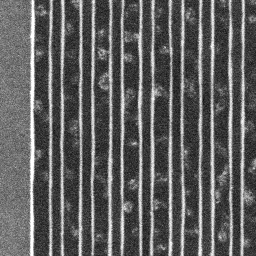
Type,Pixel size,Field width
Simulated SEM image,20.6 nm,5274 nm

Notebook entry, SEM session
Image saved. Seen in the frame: parallel lines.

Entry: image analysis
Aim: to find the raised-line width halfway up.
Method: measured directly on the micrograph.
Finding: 391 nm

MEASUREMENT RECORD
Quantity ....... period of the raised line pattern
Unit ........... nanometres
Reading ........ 618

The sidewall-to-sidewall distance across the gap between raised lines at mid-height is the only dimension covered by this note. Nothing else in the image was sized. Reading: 0.227 micrometres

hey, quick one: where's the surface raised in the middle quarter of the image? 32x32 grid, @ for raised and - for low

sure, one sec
@@@@---@@@@@---@@@@---@@@@@---@@
@@@@---@@@@@---@@@@---@@@@@---@@
@@@@---@@@@@---@@@@---@@@@@---@@
@@@@---@@@@@---@@@@---@@@@@---@@
@@@@---@@@@@---@@@@---@@@@@---@@
@@@@---@@@@@---@@@@----@@@@---@@
@@@@---@@@@@---@@@@---@@@@@---@@
@@@@---@@@@----@@@@---@@@@@--@@@
@@@@---@@@@@---@@@@---@@@@@--@@@
@@@@---@@@@@---@@@@---@@@@@--@@@
@@@@---@@@@@---@@@@---@@@@@--@@@
@@@@---@@@@@---@@@@---@@@@---@@@
@@@@---@@@@@---@@@@---@@@@@--@@@
@@@@---@@@@@---@@@@---@@@@---@@@
@@@@---@@@@@---@@@@---@@@@---@@@
@@@@---@@@@@---@@@@---@@@@---@@@
@@@@---@@@@----@@@@---@@@@---@@@
@@@@---@@@@----@@@@---@@@@@--@@@
@@@@---@@@@----@@@@---@@@@---@@@
@@@@---@@@@@---@@@@---@@@@@--@@@
@@@@---@@@@@--@@@@@---@@@@----@@
@@@@---@@@@---@@@@@---@@@@----@@
@@@@---@@@@---@@@@@---@@@@---@@@
@@@@---@@@@---@@@@@---@@@@---@@@
@@@@---@@@@---@@@@@---@@@@----@@
@@@@---@@@@---@@@@@---@@@@----@@
@@@@---@@@@---@@@@@---@@@@----@@
@@@@---@@@@---@@@@@---@@@@----@@
@@@@---@@@@---@@@@@---@@@@----@@
@@@@---@@@@---@@@@@---@@@@@---@@
@@@@---@@@@---@@@@@---@@@@@---@@
@@@@---@@@@---@@@@@---@@@@@---@@